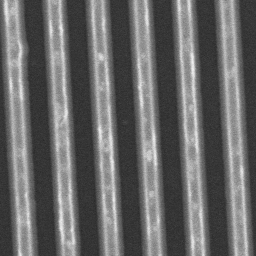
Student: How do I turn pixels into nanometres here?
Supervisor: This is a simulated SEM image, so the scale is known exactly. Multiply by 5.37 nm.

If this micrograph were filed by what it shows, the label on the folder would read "parallel lines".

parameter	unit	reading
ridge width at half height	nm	95.8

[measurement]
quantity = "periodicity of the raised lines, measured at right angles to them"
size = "231 nm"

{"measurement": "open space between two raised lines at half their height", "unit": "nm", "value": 135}